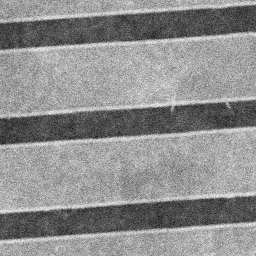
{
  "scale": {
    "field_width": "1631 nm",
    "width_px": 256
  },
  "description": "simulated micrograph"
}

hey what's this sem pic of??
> one or a few lines or trenches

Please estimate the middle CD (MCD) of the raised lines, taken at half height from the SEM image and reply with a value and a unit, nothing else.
64.5 px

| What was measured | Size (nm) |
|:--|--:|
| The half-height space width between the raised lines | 194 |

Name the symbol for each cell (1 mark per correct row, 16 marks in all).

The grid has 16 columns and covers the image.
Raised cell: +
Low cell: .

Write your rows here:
++++++++++++....
................
...........+++++
++++++++++++++++
++++++++++++++++
++++++++++++++++
+++++++++++.....
................
..........++++++
++++++++++++++++
++++++++++++++++
++++++++++++++++
++++++++++......
................
.........+++++++
++++++++++++++++